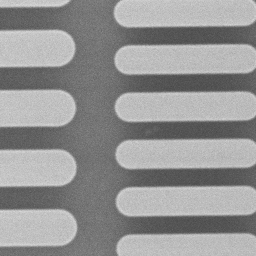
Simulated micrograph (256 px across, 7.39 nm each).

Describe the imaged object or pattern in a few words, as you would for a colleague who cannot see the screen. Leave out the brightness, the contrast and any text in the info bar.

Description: groups of lines, slits or small figures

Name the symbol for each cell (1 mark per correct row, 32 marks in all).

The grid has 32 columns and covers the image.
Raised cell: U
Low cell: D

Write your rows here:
UUUUUUUUDDDDDDDUUUUUUUUUUUUUUUUU
DDDDDDDDDDDDDDUUUUUUUUUUUUUUUUUU
DDDDDDDDDDDDDDDUUUUUUUUUUUUUUUUU
DDDDDDDDDDDDDDDDDDDDDDDDDDDDDDDD
UUUUUUUUUDDDDDDDDDDDDDDDDDDDDDDD
UUUUUUUUUDDDDDDDDDDDDDDDDDDDDDDD
UUUUUUUUUDDDDDDUUUUUUUUUUUUUUUUU
UUUUUUUUUDDDDDUUUUUUUUUUUUUUUUUU
DDDDDDDDDDDDDDDUUUUUUUUUUUUUUUUU
DDDDDDDDDDDDDDDDDDDDDDDDDDDDDDDD
DDDDDDDDDDDDDDDDDDDDDDDDDDDDDDDD
UUUUUUUUDDDDDDDDDDDDDDDDDDDDDUUD
UUUUUUUUUDDDDDDUUUUUUUUUUUUUUUUU
UUUUUUUUUDDDDDUUUUUUUUUUUUUUUUUU
UUUUUUUUUDDDDDDUUUUUUUUUUUUUUUUU
UUUUUUUUDDDDDDDDDDDDDDDDDDDDDDDD
DDDDDDDDDDDDDDDDDDDDDDDDDDDDDDDD
DDDDDDDDDDDDDDDDDDDDDDDDUUUUUUUD
DDDDDDDDDDDDDDDUUUUUUUUUUUUUUUUU
UUUUUUUUUDDDDDDUUUUUUUUUUUUUUUUU
UUUUUUUUUDDDDDDUUUUUUUUUUUUUUUUU
UUUUUUUUUDDDDDDDDDDDDDDDDDDDDDDD
UUUUUUUUUDDDDDDDDDDDDDDDDDDDDDDD
DDDDDDDDDDDDDDDDDDDUUUUUUUUUUUUD
DDDDDDDDDDDDDDDUUUUUUUUUUUUUUUUU
DDDDDDDDDDDDDDDUUUUUUUUUUUUUUUUU
UUUUUUUUDDDDDDDUUUUUUUUUUUUUUUUU
UUUUUUUUUDDDDDDDDDDDDDDDDDDDDDDD
UUUUUUUUUDDDDDDDDDDDDDDDDDDDDDDD
UUUUUUUUUDDDDDDDUUUUUUUUUUUUUUUU
UUUUUUUUDDDDDDDUUUUUUUUUUUUUUUUU
DDDDDDDDDDDDDDDUUUUUUUUUUUUUUUUU